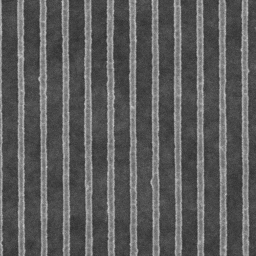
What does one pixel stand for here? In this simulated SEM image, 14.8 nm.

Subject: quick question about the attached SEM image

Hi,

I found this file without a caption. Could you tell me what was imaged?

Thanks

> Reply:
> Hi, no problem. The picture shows parallel lines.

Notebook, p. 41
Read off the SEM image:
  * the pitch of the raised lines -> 330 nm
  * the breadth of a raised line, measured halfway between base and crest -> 6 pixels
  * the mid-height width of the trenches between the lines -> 245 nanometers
